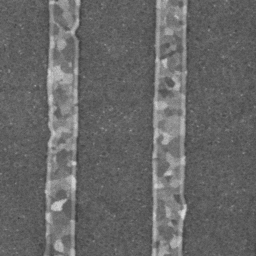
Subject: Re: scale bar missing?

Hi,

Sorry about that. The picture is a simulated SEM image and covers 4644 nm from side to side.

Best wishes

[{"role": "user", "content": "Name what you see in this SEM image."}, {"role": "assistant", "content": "one or a few lines or trenches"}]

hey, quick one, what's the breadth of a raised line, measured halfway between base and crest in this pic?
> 474 nm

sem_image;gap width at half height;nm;1470